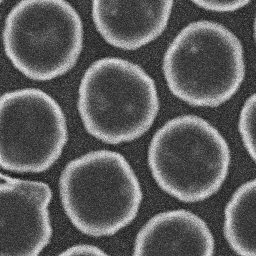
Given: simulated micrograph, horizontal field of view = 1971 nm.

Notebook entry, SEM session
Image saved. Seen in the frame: raised bodies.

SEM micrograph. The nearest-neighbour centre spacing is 716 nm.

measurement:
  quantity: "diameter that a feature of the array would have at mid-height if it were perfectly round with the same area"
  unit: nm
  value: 586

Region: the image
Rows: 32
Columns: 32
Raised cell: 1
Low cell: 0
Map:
00011111000011111111100001111100
00111111100011111111100000000000
01111111110011111111100000000000
01111111110001111111000011100000
01111111110001111110000111111000
01111111110000011000001111111000
01111111100000000000011111111100
00111111100000000000011111111100
00011111000011110000011111111100
00000100000111111100011111111100
00000000000111111110011111111100
00010000001111111110001111111000
11111100001111111110000011100000
11111110001111111110000000000001
11111110000111111110000000000011
11111111000111111100011110000011
11111111000011111000111111100011
11111111000000000000111111100001
11111110000000000001111111110001
11111110000011100001111111110000
11111100011111110001111111110000
00000000111111110001111111110000
00000000111111111000111111110000
11111100111111111000011111100001
11111100111111111000000110000011
11111100111111111000000000000111
11111100011111111000000000000111
11111100011111110000111100000111
11111100001111000001111110000111
11111100000000000011111111000111
11111000000000000111111111000111
11110000011100000111111111000011